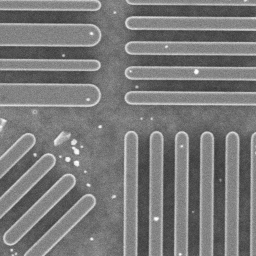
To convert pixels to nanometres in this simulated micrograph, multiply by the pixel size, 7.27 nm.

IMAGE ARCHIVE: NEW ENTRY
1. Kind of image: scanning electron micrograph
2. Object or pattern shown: groups of lines, slits or small figures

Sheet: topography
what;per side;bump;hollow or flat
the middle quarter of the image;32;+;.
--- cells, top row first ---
+++++++++.......................
.....+++.......+++++++++++++++++
...............+++++++++++++++++
................++++++++++++++++
................................
++++++++........................
+++++++++.......................
+++++++++.......++++++++++++++++
+++++++++......+++++++++++++++++
+++++++++.......++++++++++++++++
................................
................................
................................
................................
................................
................................
................................
................++....++....+++.
...............+++....+++...+++.
...............+++....+++...+++.
...............+++....+++...+++.
...............+++....+++...+++.
...............+++....+++...+++.
...............+++....+++...+++.
...............+++....+++...+++.
...............+++....+++...+++.
...............+++....+++...+++.
...............+++....+++...+++.
+++............+++....+++...+++.
+++............+++....+++...+++.
++.............+++....+++...+++.
+..............+++....+++...+++.